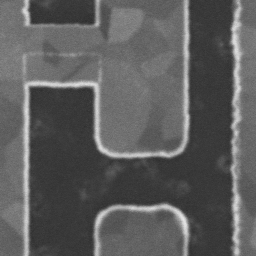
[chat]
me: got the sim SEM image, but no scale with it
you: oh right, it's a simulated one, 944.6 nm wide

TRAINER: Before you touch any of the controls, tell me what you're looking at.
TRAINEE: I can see one or a few lines or trenches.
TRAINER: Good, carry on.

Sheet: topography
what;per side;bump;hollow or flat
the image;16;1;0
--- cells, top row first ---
1100001111110001
1100001111110001
1111111111110001
1111111111110001
1111111111110001
1100001111110001
1100001111110001
1100001111110001
1100001111110001
1100000111100001
1100000000000001
1100000000000001
1100000000000001
1100001111100001
1100001111110001
1100001111110001